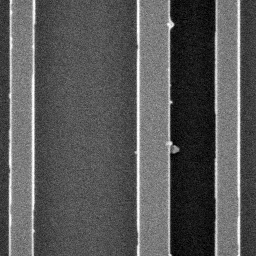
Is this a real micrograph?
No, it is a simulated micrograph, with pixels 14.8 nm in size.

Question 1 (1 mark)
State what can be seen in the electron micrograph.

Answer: lines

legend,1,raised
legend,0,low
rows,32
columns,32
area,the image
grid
01110000000000000111100000011100
01110000000000000111100000011100
01110000000000000111100000011100
01110000000000000111100000011100
01110000000000000111100000011100
01110000000000000111100000011100
01110000000000000111100000011100
01110000000000000111100000011100
01110000000000000111100000011100
01110000000000000111100000011100
01110000000000000111100000011100
01110000000000000111100000011100
01110000000000000111100000011100
01110000000000000111100000011100
01110000000000000111100000011100
01110000000000000111100000011100
01110000000000000111100000011100
01110000000000000111100000011100
01110000000000000111100000011100
01110000000000000111100000011100
01110000000000000111100000011100
01110000000000000111100000011100
01110000000000000111100000011100
01110000000000000111100000011100
01110000000000000111100000011100
01110000000000000111100000011100
01110000000000000111100000011100
01110000000000000111100000011100
01110000000000000111100000011100
01110000000000000111100000011100
01110000000000000111100000011100
01110000000000000111100000011100